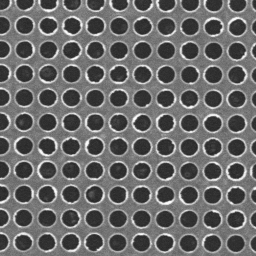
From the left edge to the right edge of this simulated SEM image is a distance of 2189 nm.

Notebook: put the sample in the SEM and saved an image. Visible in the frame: a regular array of holes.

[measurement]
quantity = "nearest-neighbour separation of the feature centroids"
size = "199 nm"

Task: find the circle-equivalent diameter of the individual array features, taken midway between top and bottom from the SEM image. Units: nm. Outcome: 148